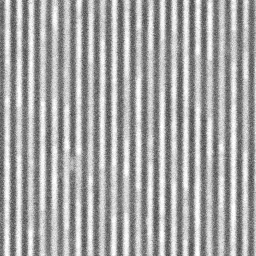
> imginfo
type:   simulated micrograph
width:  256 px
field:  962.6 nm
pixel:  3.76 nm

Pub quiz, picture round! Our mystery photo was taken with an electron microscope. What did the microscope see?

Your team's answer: parallel lines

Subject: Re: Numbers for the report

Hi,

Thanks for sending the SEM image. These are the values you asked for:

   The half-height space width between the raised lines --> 29.6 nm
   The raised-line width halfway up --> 0.0146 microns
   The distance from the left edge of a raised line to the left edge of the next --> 0.0447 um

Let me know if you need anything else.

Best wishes